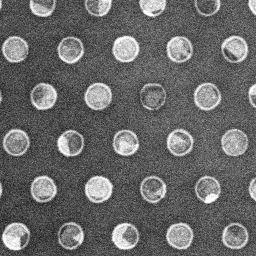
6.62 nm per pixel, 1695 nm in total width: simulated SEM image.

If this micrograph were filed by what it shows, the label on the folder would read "a regular array of raised bodies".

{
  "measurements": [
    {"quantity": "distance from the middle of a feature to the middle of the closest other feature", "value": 357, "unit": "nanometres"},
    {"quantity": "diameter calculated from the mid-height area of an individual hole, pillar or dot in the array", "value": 163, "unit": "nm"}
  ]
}